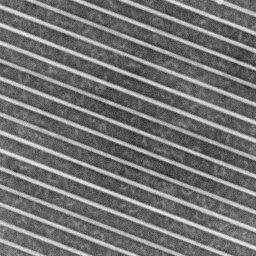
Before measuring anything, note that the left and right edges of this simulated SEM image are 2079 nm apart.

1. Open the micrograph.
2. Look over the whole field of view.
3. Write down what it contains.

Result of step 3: parallel lines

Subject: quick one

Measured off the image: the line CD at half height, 0.0218 micrometres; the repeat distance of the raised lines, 136 nanometers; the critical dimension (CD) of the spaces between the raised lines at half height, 116 nm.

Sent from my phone